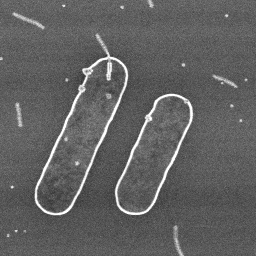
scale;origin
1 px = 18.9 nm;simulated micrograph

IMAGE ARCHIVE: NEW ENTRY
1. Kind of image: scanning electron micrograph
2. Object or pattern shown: groups of lines, slits or small figures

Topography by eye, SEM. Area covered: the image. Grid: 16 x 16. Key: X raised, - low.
----------------
----------------
----------------
----------------
-----XXX--------
-----XXX--------
-----XX---XX----
----XXX--XXX----
----XX---XX-----
---XXX--XXX-----
---XXX--XXX-----
--XXX--XXX------
--XXX--XXX------
----------------
----------------
----------------